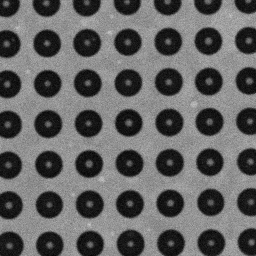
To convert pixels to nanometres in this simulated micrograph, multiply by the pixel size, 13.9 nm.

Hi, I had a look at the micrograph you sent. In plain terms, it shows an array of small figures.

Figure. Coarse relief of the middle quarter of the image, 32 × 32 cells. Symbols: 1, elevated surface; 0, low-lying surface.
11111111111111111111111111111111
11110001111111100011111100001111
11100000011110000001111000000111
11100000011110000001111000000011
11000000011100000000111000000011
11000000001100000000111000000011
11100000011110000001111000000111
11110000111111000011111100001111
11111111111111111111111111111111
11111111111111111111111111111111
11111111111111111111111111111111
11111001111111100011111100001111
11110000011110000001111100000111
11100000011110000001111000000011
11100000001110000000111000100011
11100000001110000000111000000011
11100000011110000001111000000111
11110000011111000011111100001111
11111111111111111111111111111111
11111111111111111111111111111111
11111111111111111111111111111111
11111101111111100111111110001111
11110000011111000001111100000111
11100000001110000000111000000011
11100000001110001000111000000011
11100000001110000000111000000011
11100000001110000000111000000011
11110000011111000001111100000111
11111001111111111111111111111111
11111111111111111111111111111111
11111111111111111111111111111111
11111101111111110111111110001111